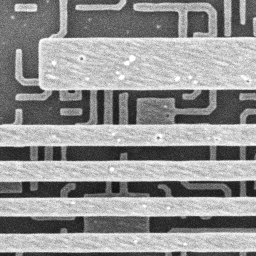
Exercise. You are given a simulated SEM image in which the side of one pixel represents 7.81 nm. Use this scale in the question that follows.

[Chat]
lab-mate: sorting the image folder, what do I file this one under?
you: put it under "wiring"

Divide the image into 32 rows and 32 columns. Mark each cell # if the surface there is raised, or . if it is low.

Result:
................................
................................
................................
................................
................................
.....###########################
.....###########################
.....###########################
.....###########################
.....###########################
.....###########################
................................
................................
................................
................................
................................
################################
################################
................................
................................
################################
################################
################################
................................
................................
################################
################################
................................
................................
################################
################################
#####.########..................